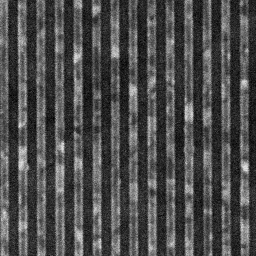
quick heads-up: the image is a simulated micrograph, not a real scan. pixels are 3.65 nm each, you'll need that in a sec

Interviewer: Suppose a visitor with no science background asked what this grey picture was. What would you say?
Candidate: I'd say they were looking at parallel lines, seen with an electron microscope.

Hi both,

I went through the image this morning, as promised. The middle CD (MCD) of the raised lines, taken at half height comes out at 27.4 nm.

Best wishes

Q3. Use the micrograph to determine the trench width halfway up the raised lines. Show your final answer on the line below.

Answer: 41.1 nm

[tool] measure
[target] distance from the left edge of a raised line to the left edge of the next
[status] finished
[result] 0.0675 micrometres